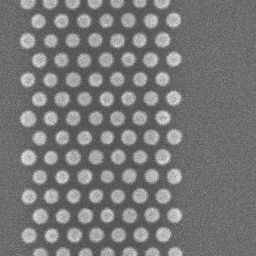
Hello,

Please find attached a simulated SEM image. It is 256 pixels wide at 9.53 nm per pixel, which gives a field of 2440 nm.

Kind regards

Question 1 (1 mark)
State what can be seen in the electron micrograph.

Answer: a regular array of raised bodies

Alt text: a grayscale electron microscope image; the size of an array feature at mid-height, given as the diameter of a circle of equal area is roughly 124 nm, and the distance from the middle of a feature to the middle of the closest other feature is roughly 209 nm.